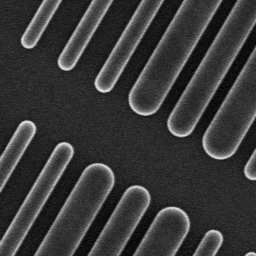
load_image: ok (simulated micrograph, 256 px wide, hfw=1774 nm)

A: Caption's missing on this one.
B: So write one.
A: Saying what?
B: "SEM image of groups of lines, slits or small figures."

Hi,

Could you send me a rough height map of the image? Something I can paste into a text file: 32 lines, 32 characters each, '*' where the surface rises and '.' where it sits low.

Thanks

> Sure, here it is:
.....**....***....**...****..***
.....**....**....***..*****..***
....**....***...***...****..****
...***....**....**...*****..****
...**....**....***..*****..****.
...*....***....**...****...***..
........**....***..*****..****..
.......***...***...****..****..*
........*....**...*****..****.**
............***...****..****..**
............**...*****..***..***
................*****..****..***
................****..****..****
.................***..****.*****
.....................****..*****
...*.................***..*****.
..**..................**..*****.
.***.....................*****..
.**....**.................****..
***...***.................***...
**....**.......................*
*....***..****.................*
*....**...****..................
....***..*****..**..............
...***...****..****.............
...**...*****..****.............
..***..*****..****..***.........
..**...*****..***..****.........
.***..*****..****..*****........
.**...****..****..*****...**....
***..*****..****..*****..***....
**...****..****..*****..***.....